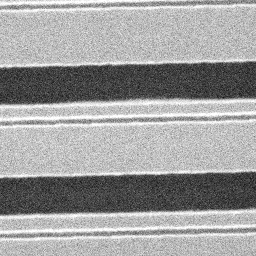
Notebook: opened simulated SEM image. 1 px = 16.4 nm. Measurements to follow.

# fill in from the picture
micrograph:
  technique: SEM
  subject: lines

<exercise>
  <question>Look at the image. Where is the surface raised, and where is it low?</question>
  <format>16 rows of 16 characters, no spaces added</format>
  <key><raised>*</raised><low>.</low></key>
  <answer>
****************
****************
****************
****************
................
................
........********
****************
****************
****************
****************
................
................
....************
****************
****************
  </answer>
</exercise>